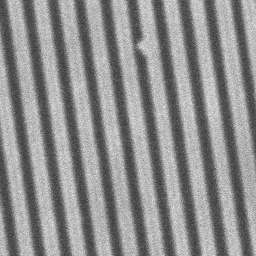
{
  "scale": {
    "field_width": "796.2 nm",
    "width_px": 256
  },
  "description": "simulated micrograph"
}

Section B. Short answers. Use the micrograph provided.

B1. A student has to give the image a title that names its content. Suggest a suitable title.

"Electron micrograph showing parallel lines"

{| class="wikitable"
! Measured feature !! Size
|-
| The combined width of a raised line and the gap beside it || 80.2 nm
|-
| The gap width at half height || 13.9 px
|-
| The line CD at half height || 0.0377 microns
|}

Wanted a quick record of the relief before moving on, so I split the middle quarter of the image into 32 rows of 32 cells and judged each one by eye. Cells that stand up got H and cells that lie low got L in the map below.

LLHHLLLLHHHLLLLHHHLLLHHHLLLLHHHL
LLHHHLLLHHHLLLLHHHLLLHHHLLLLHHHL
LLHHHLLLHHHLLLLHHHLLLLHHLLLLHHHL
LLHHHLLLLHHLLLLHHHLLLLHHLLLLHHHL
LLHHHLLLLHHHLLLHHHLLLLHHHLLLHHHL
LLHHHLLLLHHHLLLHHHLLLLHHHLLLHHHL
LLHHHLLLLHHHLLLLHHHLLLHHHLLLLHHL
LLLHHHLLLHHHLLLLHHHLLLHHHLLLLHHH
LLLHHHLLLHHHLLLLHHHLLLHHHLLLLHHH
LLLHHHLLLHHHLLLLHHHLLLLHHLLLLHHH
LLLHHHLLLLHHHLLLHHHLLLLHHLLLLHHH
LLLHHHLLLLHHHLLLHHHLLLLHHHLLLHHH
LLLHHHLLLLHHHLLLHHHLLLLHHHLLLHHH
LLLLHHLLLLHHHLLLLHHHLLLHHHLLLLHH
LLLLHHHLLLHHHLLLLHHHLLLHHHLLLLHH
LLLLHHHLLLHHHLLLLHHHLLLLHHLLLLHH
LLLLHHHLLLLHHLLLLHHHLLLLHHLLLLHH
HLLLHHHLLLLHHHLLLHHHLLLLHHHLLLHH
HLLLHHHLLLLHHHLLLHHHLLLLHHHLLLHH
HLLLHHHLLLLHHHLLLLHHLLLLHHHLLLHH
HLLLLHHHLLLHHHLLLLHHHLLLHHHLLLLH
HLLLLHHHLLLHHHLLLLHHHLLLHHHLLLLH
HLLLLHHHLLLHHHLLLLHHHLLLLHHLLLLH
HLLLLHHHLLLLHHHLLLHHHLLLLHHLLLLH
HHLLLHHHLLLLHHHLLLHHHLLLLHHHLLLH
HHLLLHHHLLLLHHHLLLHHHLLLLHHHLLLH
HHLLLLHHLLLLHHHLLLLHHHLLLHHHLLLL
HHLLLLHHHLLLHHHLLLLHHHLLLHHHLLLL
HHLLLLHHHLLLHHHLLLLHHHLLLHHHLLLL
HHLLLLHHHLLLLHHLLLLHHHLLLLHHLLLL
HHHLLLHHHLLLLHHHLLLHHHLLLLHHHLLL
HHHLLLHHHLLLLHHHLLLHHHLLLLHHHLLL